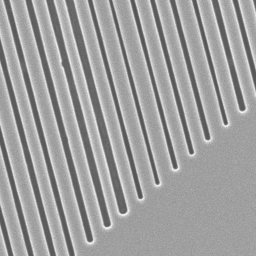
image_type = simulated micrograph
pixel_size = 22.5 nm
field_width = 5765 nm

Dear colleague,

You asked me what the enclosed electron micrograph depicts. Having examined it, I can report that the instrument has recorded parallel lines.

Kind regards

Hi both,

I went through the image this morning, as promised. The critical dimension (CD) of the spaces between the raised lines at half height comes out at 5.44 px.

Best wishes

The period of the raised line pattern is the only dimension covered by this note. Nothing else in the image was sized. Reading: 453 nanometres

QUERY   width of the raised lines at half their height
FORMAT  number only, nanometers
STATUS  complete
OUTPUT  330